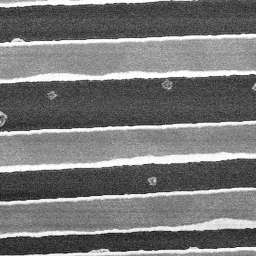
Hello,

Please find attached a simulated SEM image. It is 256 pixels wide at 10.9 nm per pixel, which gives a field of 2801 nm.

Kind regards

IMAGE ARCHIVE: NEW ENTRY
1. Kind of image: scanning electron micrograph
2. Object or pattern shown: lines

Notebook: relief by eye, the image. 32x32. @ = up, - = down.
@@@@----------------------------
--------------------------------
--------------------------------
--------------------------------
---------------------------@@@@@
@@@@@@@@@@@@@@@@@@@@@@@@@@@@@@@@
@@@@@@@@@@@@@@@@@@@@@@@@@@@@@@@@
@@@@@@@@@@@@@@@@@@@@@@@@@@@@@@@@
@@@@@@@@@@@@@@@@@@@@@@@@@@@@@@@@
@@@@@@@@@@@@@@@@@-@@@-----------
--------------------------------
--------------------------------
--------------------------------
--------------------------------
--------------------------------
-------------------------@@@@@@@
--@@@@@@@@@@@@@@@@@@@@@@@@@@@@@@
@@@@@@@@@@@@@@@@@@@@@@@@@@@@@@@@
@@@@@@@@@@@@@@@@@@@@@@@@@@@@@@@@
@@@@@@@@@@@@@@@@@@@@@@@@@@@@@@-@
@@@@@@@@@@@@@@------------------
--------------------------------
--------------------------------
--------------------------------
--------------@@@@@@@@@@@@@@@@@@
@@@@@@@@@@@@@@@@@@@@@@@@@@@@@@@@
@@@@@@@@@@@@@@@@@@@@@@@@@@@@@@@@
@@@@@@@@@@@@@@@@@@@@@@@@@@@@@@@@
@@@@@@@@@@@@@@@@@@@@@@@@--------
@-------------------------------
--------------------------------
----------------@@@@@@@@@@@@@@@@